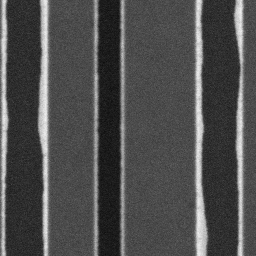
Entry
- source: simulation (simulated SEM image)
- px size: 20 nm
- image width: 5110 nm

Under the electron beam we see lines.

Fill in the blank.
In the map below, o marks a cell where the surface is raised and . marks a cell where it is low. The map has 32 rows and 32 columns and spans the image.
o.....oooooo...oooooooooo.....oo
......oooooo...oooooooooo.....oo
o.....oooooo...oooooooooo.....oo
o.....oooooo...oooooooooo.....oo
o.....oooooo...oooooooooo.....oo
o.....oooooo...oooooooooo.....oo
o.....oooooo...oooooooooo.....oo
o.....oooooo...oooooooooo.....oo
......oooooo...oooooooooo.....oo
......oooooo...oooooooooo.....oo
o....ooooooo...oooooooooo.....oo
.....ooooooo...oooooooooo.....oo
o....ooooooo...oooooooooo.....oo
o....ooooooo...oooooooooo.....oo
o....ooooooo...oooooooooo.....oo
o....ooooooo...oooooooooo.....oo
o....ooooooo...oooooooooo.....oo
o....ooooooo...oooooooooo.....oo
o.....oooooo...oooooooooo.....oo
......oooooo...oooooooooo.....oo
......oooooo...oooooooooo.....oo
......oooooo...oooooooooo.....oo
......oooooo...oooooooooo.....oo
......oooooo...oooooooooo.....oo
......oooooo...oooooooooo.....oo
......oooooo...oooooooooo.....oo
......oooooo...oooooooooo.....oo
......oooooo...oooooooooo.....oo
......oooooo...oooooooooo.....oo
......oooooo...oooooooooo.....oo
......oooooo...oooooooooo.....oo
......oooooo...oooooooooo.....oo